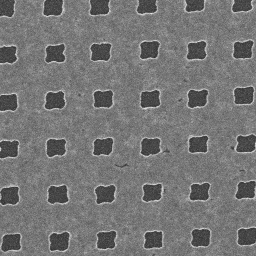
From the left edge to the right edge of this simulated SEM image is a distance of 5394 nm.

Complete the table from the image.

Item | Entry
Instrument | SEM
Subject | a regular array of holes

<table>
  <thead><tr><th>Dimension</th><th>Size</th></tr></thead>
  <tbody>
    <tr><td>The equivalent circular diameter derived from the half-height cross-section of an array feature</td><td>419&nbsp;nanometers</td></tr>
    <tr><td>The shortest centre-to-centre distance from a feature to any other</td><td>46.2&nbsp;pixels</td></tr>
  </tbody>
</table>